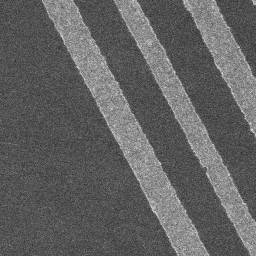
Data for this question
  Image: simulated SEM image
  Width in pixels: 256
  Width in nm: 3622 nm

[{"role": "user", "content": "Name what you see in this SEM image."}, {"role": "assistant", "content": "one or a few lines or trenches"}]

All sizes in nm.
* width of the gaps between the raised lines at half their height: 526